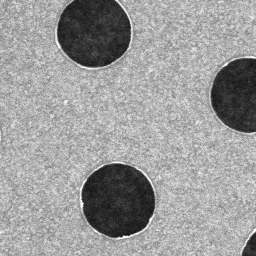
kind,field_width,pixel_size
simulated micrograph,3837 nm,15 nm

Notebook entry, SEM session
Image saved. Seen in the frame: holes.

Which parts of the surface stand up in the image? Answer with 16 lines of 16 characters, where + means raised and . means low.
++++....++++++++
++++....++++++++
++++....++++++++
++++....++++++++
++++++++++++++..
+++++++++++++...
+++++++++++++...
++++++++++++++..
++++++++++++++++
++++++++++++++++
++++++..++++++++
+++++....+++++++
+++++.....++++++
+++++....+++++++
++++++...+++++++
+++++++++++++++.